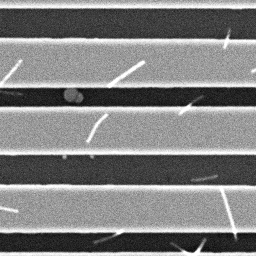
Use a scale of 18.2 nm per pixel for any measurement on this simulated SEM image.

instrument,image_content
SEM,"lines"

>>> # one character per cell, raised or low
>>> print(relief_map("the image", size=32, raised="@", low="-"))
@@@@@@@@@@@@@@@@@@@@@@@@@@@@@@@@
--------------------------------
--------------------------------
--------------------------------
--------------------------------
@@@@@@@@@@@@@@@@@@@@@@@@@@@@@@@@
@@@@@@@@@@@@@@@@@@@@@@@@@@@@@@@@
@@@@@@@@@@@@@@@@@@@@@@@@@@@@@@@@
@@@@@@@@@@@@@@@@@@@@@@@@@@@@@@@@
@@@@@@@@@@@@@@@@@@@@@@@@@@@@@@@@
@@@@@@@@@@@@@@@@@@@@@@@@@@@@@@@@
--------------------------------
--------------------------------
@@@@@@@@@@@@@@@@@@@@@@@@@@@@@@@@
@@@@@@@@@@@@@@@@@@@@@@@@@@@@@@@@
@@@@@@@@@@@@@@@@@@@@@@@@@@@@@@@@
@@@@@@@@@@@@@@@@@@@@@@@@@@@@@@@@
@@@@@@@@@@@@@@@@@@@@@@@@@@@@@@@@
@@@@@@@@@@@@@@@@@@@@@@@@@@@@@@@@
--------------------------------
--------------------------------
--------------------------------
--------------------------------
@@@@@@@@@@@@@@@@@@@@@@@@@@@@@@@@
@@@@@@@@@@@@@@@@@@@@@@@@@@@@@@@@
@@@@@@@@@@@@@@@@@@@@@@@@@@@@@@@@
@@@@@@@@@@@@@@@@@@@@@@@@@@@@@@@@
@@@@@@@@@@@@@@@@@@@@@@@@@@@@@@@@
@@@@@@@@@@@@@@@@@@@@@@@@@@@@@@@@
--------------------------------
--------------------------------
----------------------@-@-------